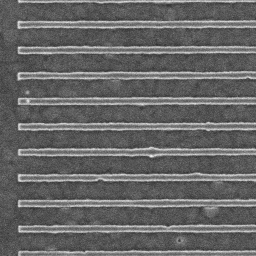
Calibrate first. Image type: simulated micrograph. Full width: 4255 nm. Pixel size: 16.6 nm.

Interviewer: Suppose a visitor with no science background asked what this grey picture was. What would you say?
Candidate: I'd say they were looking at parallel lines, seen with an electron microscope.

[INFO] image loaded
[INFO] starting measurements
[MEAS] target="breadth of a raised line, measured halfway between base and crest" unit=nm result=108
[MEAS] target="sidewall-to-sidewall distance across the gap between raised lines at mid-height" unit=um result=0.316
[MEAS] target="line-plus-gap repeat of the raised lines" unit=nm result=420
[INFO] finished